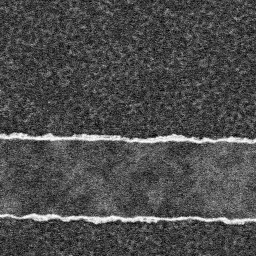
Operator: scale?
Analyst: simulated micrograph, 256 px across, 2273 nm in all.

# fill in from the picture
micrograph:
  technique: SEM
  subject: one or a few lines or trenches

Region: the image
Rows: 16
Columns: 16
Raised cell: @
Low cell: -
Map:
@@@@@@@@@@@@@@@@
@@@@@@@@@@@@@@@@
@@@@@@@@@@@@@@@@
@@@@@@@@@@@@@@@@
@@@@@@@@@@@@@@@@
@@@@@@@@@@@@@@@@
@@@@@@@@@@@@@@@@
@@@@@@@@@@@@@@@@
@@@@@@@@@@@@@@@@
----------------
----------------
----------------
----------------
@---------------
@@@@@@@@@@@@@@@@
@@@@@@@@@@@@@@@@